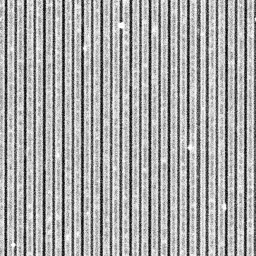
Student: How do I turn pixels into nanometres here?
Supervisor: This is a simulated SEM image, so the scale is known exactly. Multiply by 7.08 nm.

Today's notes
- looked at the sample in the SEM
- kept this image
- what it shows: parallel lines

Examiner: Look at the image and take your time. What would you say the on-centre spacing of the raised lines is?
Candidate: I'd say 67.8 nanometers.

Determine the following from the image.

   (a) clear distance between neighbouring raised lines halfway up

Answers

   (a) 0.0257 micrometres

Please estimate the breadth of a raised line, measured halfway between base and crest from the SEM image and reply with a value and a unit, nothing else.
45.1 nm